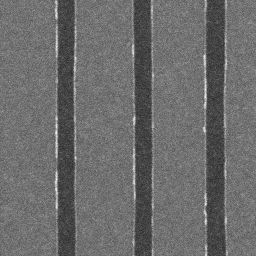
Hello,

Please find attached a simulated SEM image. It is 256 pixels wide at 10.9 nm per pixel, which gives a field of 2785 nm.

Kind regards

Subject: one or a few lines or trenches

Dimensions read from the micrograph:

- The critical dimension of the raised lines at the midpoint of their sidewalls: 216 nanometres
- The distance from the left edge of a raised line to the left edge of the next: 0.81 micrometres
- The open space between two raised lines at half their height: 598 nm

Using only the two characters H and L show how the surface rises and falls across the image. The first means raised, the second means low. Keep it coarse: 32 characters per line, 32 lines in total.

LLLLLLLHHLLLLLLLLHHLLLLLLLHHLLLL
LLLLLLLHHLLLLLLLLHHLLLLLLLHHLLLL
LLLLLLLHHLLLLLLLLHHLLLLLLLHHLLLL
LLLLLLLHHLLLLLLLLHHLLLLLLLHHLLLL
LLLLLLLHHLLLLLLLLHHLLLLLLLHHLLLL
LLLLLLLHHLLLLLLLLHHLLLLLLLHHLLLL
LLLLLLLHHLLLLLLLLHHLLLLLLLHHLLLL
LLLLLLLHHLLLLLLLLHHLLLLLLLHHLLLL
LLLLLLLHHLLLLLLLLHHLLLLLLLHHLLLL
LLLLLLLHHLLLLLLLLHHLLLLLLLHHLLLL
LLLLLLLHHLLLLLLLLHHLLLLLLLHHLLLL
LLLLLLLHHLLLLLLLLHHLLLLLLLHHLLLL
LLLLLLLHHLLLLLLLLHHLLLLLLLHHLLLL
LLLLLLLHHLLLLLLLLHHLLLLLLLHHLLLL
LLLLLLLHHLLLLLLLLHHLLLLLLLHHLLLL
LLLLLLLHHLLLLLLLLHHLLLLLLLHHLLLL
LLLLLLLHHLLLLLLLLHHLLLLLLLHHLLLL
LLLLLLLHHLLLLLLLLHHLLLLLLLHHLLLL
LLLLLLLHHLLLLLLLLHHLLLLLLLHHLLLL
LLLLLLLHHLLLLLLLLHHLLLLLLLHHLLLL
LLLLLLLHHLLLLLLLLHHLLLLLLLHHLLLL
LLLLLLLHHLLLLLLLLHHLLLLLLLHHLLLL
LLLLLLLHHLLLLLLLLHHLLLLLLLHHLLLL
LLLLLLLHHLLLLLLLLHHLLLLLLLHHLLLL
LLLLLLLHHLLLLLLLLHHLLLLLLLHHLLLL
LLLLLLLHHLLLLLLLLHHLLLLLLLHHLLLL
LLLLLLLHHLLLLLLLLHHLLLLLLLHHLLLL
LLLLLLLHHLLLLLLLLHHLLLLLLLHHLLLL
LLLLLLLHHHLLLLLLLHHLLLLLLLHHLLLL
LLLLLLLHHHLLLLLLLHHLLLLLLLHHLLLL
LLLLLLLHHHLLLLLLLHHLLLLLLLHHLLLL
LLLLLLLHHHLLLLLLLHHLLLLLLLHHLLLL